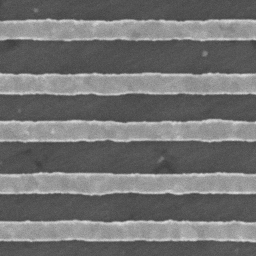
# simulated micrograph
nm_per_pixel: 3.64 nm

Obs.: lines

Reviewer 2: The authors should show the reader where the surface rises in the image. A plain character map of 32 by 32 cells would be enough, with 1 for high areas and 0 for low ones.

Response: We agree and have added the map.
00000000000000000000000000000000
00000000000000000000000000000000
00000110000000000000000000000000
11111111111111111111111111111111
11111111111111111111111111111111
00000000000000000000000000000000
00000000000000000000000000000000
00000000000000000000000000000000
00000000000000000000000000000000
11111111111111111111111111111111
11111111111111111111111111111111
11111111111111111111111111111111
00000000000000000000000000000000
00000000000000000000000000000000
00000000000000000000000000000000
11111111111111111111111111111111
11111111111111111111111111111111
11111111111110111111111111111111
00000000000000000000000000000000
00000000000000000000000000000000
00000000000000000000000000000000
00000000000000000000000000000000
11111111111111111111111111111111
11111111111111111111111111111111
00000000000000000000000000000000
00000000000000000000000000000000
00000000000000000000000000000000
00000000000000000000000000000000
11111111111111111111111111111111
11111111111111111111111111111111
00000000000000000000000000000000
00000000000000000000000000000000